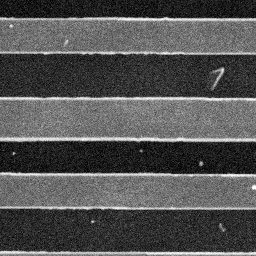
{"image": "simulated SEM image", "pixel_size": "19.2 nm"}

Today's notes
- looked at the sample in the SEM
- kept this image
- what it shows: lines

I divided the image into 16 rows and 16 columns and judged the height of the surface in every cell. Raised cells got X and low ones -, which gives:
----------------
XXXXXXXXXXXXXXXX
XXXXXXXXXXXXXXXX
----------------
----------------
----------------
XXXXXXXXXXXXXXXX
XXXXXXXXXXXXXXXX
XXXXXXXXXXXXXXXX
----------------
----------------
XXXXXXXXXXXXXXXX
XXXXXXXXXXXXXXXX
----------------
----------------
----------------